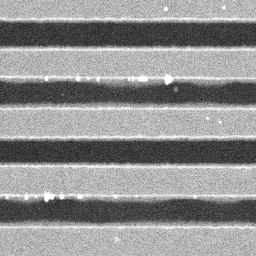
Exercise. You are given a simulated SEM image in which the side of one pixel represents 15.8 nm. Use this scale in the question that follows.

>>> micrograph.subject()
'lines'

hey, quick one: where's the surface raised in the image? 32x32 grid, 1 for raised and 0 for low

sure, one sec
11111111111111111111111111111111
11111111111111111111111111111111
00001100010000001110000011101011
00000000000000000000000000000000
00000000000000000000000000000000
00000000000000000000000000000000
11111111111111111111111111111111
11111111111111111111111111111111
11111111111111111111111111111111
11111111111111111111111111111111
00000000000000000000000000000000
00000000000000000000000000000000
00000000000000000000000000000000
11111111111111111111111111111111
11111111111111111111111111111111
11111111111111111111111111111111
11111111111111111111111111111111
00000000000000000000000000000000
00000000000000000000000000000000
00000000000000000000000000000000
00000000000000000000000000000000
11111111111111111111111111111111
11111111111111111111111111111111
11111111111111111111111111111111
11111111011011111111100011111111
00000000000000000000000000000000
00000000000000000000000000000000
00000000000000000000000000000000
11111111111111111111111111111111
11111111111111111111111111111111
11111111111111111111111111111111
11111111111111111111111111111111